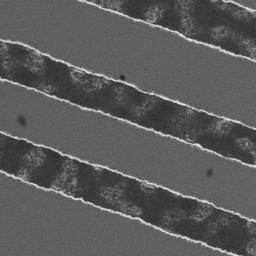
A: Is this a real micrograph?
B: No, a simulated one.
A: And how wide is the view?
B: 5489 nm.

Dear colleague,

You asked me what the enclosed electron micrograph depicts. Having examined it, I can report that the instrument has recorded one or a few lines or trenches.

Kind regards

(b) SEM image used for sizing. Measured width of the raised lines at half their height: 815 nm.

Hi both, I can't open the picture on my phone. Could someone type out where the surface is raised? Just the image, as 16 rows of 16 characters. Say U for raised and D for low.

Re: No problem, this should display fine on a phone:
DDDDDDUUUUUUUUUD
DDDDDDDDDUUUUUUU
DDDDDDDDDDDDUUUU
UUUDDDDDDDDDDDDU
UUUUUUDDDDDDDDDD
DDUUUUUUUDDDDDDD
DDDDDUUUUUUDDDDD
DDDDDDDDUUUUUUDD
UDDDDDDDDDDUUUUU
UUUUDDDDDDDDDUUU
UUUUUUUDDDDDDDDD
DDUUUUUUUUDDDDDD
DDDDDUUUUUUUUDDD
DDDDDDDDUUUUUUUD
DDDDDDDDDDUUUUUU
DDDDDDDDDDDDDUUU